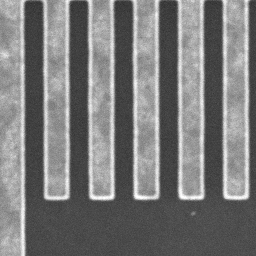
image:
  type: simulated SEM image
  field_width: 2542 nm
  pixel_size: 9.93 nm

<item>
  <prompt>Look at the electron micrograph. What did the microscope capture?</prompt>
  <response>groups of lines, slits or small figures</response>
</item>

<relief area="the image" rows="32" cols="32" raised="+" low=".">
+++...++...+++...+++...++...+++.
+++...++...+++...+++...++...+++.
+++...++...+++...+++...++...+++.
+++...++...+++...+++...++...+++.
+++...++...+++...+++...++...+++.
+++...++...+++...+++...++...+++.
+++...++...+++...+++...++...+++.
+++...++...+++...+++...++...+++.
+++...++...+++...+++...++...+++.
+++...++...+++...+++...++...+++.
+++...++...+++...+++...++...+++.
+++...++...+++...+++...++...+++.
+++...++...+++...+++...++...+++.
+++...++...+++...+++...++...+++.
+++...++...+++...+++...++...+++.
+++...++...+++...+++...++...+++.
+++...++...+++...+++...++...+++.
+++...++...+++...+++...++...+++.
+++...++...+++...+++...++...+++.
+++...++...+++...+++...++...+++.
+++...++...+++...+++...++...+++.
+++...++...+++...+++...++...+++.
+++...++...+++...+++...++...+++.
+++...++...+++...+++...++...+++.
+++...++....++...++....++...+++.
+++.............................
+++.............................
+++.............................
+++.............................
+++.............................
+++.............................
+++.............................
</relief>